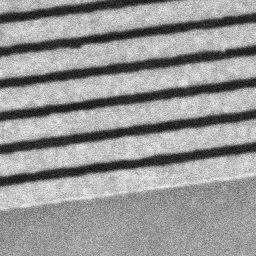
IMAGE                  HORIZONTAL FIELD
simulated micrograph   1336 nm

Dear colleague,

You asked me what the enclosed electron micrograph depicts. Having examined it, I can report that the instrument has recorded parallel lines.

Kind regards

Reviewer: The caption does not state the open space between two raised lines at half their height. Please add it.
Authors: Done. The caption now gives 53.1 nanometres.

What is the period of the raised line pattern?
0.168 um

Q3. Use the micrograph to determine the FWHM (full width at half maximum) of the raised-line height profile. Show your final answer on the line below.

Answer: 115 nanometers